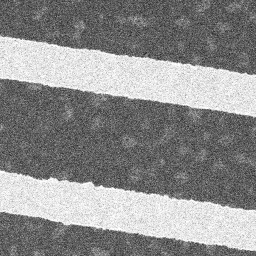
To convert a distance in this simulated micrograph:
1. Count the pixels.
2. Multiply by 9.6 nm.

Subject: one or a few lines or trenches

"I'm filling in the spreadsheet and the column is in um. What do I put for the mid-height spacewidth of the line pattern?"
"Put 0.896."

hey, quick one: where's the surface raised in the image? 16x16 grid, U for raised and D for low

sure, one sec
DDDDDDDDDDDDDDDD
DDDDDDDDDDDDDDDD
UDDDDDDDDDDDDDDD
UUUUUUUUDDDDDDDD
UUUUUUUUUUUUUUDD
DDDDUUUUUUUUUUUU
DDDDDDDDDDDUUUUU
DDDDDDDDDDDDDDDD
DDDDDDDDDDDDDDDD
DDDDDDDDDDDDDDDD
DDDDDDDDDDDDDDDD
UUUUUDDDDDDDDDDD
UUUUUUUUUUUUDDDD
DDUUUUUUUUUUUUUU
DDDDDDDDUUUUUUUU
DDDDDDDDDDDDDDDU